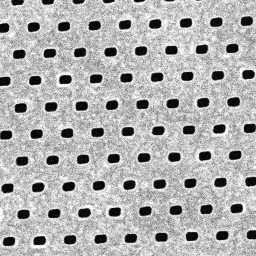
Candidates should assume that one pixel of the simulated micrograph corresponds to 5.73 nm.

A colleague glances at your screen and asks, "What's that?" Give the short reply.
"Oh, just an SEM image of a regular array of holes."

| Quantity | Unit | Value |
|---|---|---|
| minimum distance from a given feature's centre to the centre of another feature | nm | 174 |